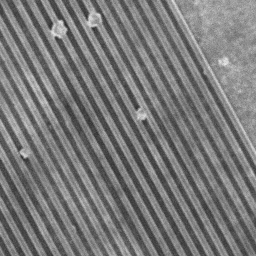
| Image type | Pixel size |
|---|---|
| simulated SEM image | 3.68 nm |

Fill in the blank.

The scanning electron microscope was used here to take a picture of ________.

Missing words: parallel lines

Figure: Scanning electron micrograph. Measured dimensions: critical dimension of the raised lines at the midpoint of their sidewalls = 5.62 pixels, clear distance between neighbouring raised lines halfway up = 24.3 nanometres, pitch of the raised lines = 45.2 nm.